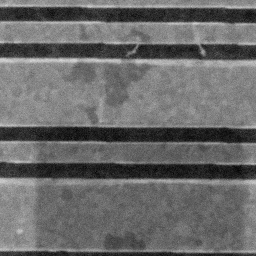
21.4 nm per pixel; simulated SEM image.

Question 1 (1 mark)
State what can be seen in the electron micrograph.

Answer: lines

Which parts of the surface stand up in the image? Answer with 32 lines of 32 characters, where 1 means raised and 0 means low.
11111111111111111111111111111111
00000000000000000000000000000000
00000000000000000000000000000000
11111111111111111111111111111111
11111111111111111111111111111111
00000000000000000100000011000001
00000000000000000000000000000000
00000000000000000000000000000000
11111111111111111111111111111111
11111111111111111111111111111111
11111111111111111111111111111111
11111111111111111111111111111111
11111111111111111111111111111111
11111111111111111111111111111111
11111111111111111111111111111111
11111111111111111111111111111111
00000000000000000000000000000000
00000000000000000000000000000000
11111111111111111111111111111111
11111111111111111111111111111111
00000000000000000000000000000000
00000000000000000000000000000000
00000000000000000000000000000000
11111111111111111111111111111111
11111111111111111111111111111111
11111111111111111111111111111111
11111111111111111111111111111111
11111111111111111111111111111111
11111111111111111111111111111111
11111111111111111111111111111111
11111111111111111111111111111111
00000000000000000000000000000000